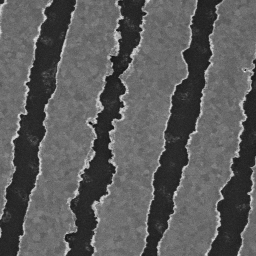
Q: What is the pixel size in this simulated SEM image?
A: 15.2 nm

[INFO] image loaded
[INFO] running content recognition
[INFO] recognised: one or a few lines or trenches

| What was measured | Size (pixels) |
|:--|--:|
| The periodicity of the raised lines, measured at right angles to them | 71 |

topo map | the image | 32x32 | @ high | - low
@@@@@@---@@@@@@---@@@@@@@--@@@@@
@@@@@----@@@@@@---@@@@@@---@@@@@
@@@@@@---@@@@@@---@@@@@@---@@@@@
@@@@@----@@@@@@---@@@@@@---@@@@@
@@@@@---@@@@@@@---@@@@@@--@@@@@@
@@@@----@@@@@@@--@@@@@@@--@@@@@@
@@@@----@@@@@@@--@@@@@@---@@@@@@
@@@@----@@@@@@---@@@@@@---@@@@@@
@@@@---@@@@@@@--@@@@@@@---@@@@@@
@@@@---@@@@@@@-@@@@@@@@---@@@@@-
@@@----@@@@@@--@@@@@@@----@@@@@-
@@@----@@@@@@---@@@@@@---@@@@@@-
@@@---@@@@@@---@@@@@@----@@@@@--
@@@---@@@@@@@--@@@@@@----@@@@@--
@@@---@@@@@@---@@@@@@----@@@@@@-
@@----@@@@@---@@@@@@@----@@@@@--
@@----@@@@@@--@@@@@@@---@@@@@@--
@@---@@@@@@@--@@@@@@@---@@@@@@--
@@---@@@@@@@--@@@@@@@--@@@@@@@--
@@---@@@@@@@--@@@@@@----@@@@@@--
@@---@@@@@@---@@@@@@---@@@@@@---
@@---@@@@@----@@@@@----@@@@@@---
@----@@@@@----@@@@@----@@@@@@---
@---@@@@@@---@@@@@@---@@@@@@----
@---@@@@@----@@@@@@---@@@@@@---@
@---@@@@@---@@@@@@@---@@@@@----@
---@@@@@@---@@@@@@@---@@@@@----@
---@@@@@@---@@@@@@---@@@@@@----@
---@@@@@@@--@@@@@@---@@@@@@----@
---@@@@@----@@@@@@--@@@@@@@---@@
--@@@@@@----@@@@@@--@@@@@@----@@
--@@@@@@----@@@@@@--@@@@@@----@@